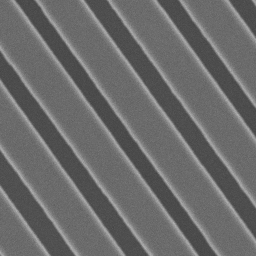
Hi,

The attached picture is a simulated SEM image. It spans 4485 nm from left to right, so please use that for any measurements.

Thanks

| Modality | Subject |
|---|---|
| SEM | lines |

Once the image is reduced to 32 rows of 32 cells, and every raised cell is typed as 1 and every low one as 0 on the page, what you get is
11000111111000111111000111111000
11100111111000011111100111111100
11110011111100011111100011111100
11110001111110001111110001111110
11111000111111000111111001111111
11111100111111000111111100111111
11111100011111100011111100011111
01111110001111110001111110001111
00111111000111111001111111001111
00111111100111111000111111000111
00011111100011111100011111100011
10001111110001111110001111110001
11000111111001111110001111111001
11100111111100111111000111111000
11100011111100011111100011111100
11110001111110011111110011111110
11111001111111001111110001111110
11111000111111000111111000111111
11111100011111100011111100011111
01111110001111110011111100011111
01111110001111111001111110001111
00111111000111111000111111000111
00011111100011111100111111100011
00001111110011111110011111100011
10001111110001111110001111110001
11000111111000111111000111111000
11000011111100011111100111111100
11100011111100011111110011111100
11110001111110001111110001111110
11111000111111000111111001111111
11111000111111100011111100111111
11111100011111100011111100011111